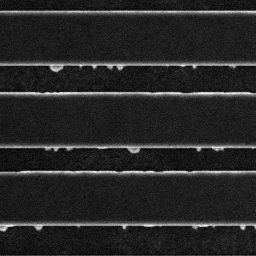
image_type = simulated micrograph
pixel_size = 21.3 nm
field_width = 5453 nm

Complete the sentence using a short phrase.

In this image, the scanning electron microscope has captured lines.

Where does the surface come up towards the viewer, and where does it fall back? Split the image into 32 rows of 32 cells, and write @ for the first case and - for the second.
--------------------------------
@@@@@@@@@@@@@@@@@@@@@@@@@@@@@@@@
@@@@@@@@@@@@@@@@@@@@@@@@@@@@@@@@
@@@@@@@@@@@@@@@@@@@@@@@@@@@@@@@@
@@@@@@@@@@@@@@@@@@@@@@@@@@@@@@@@
@@@@@@@@@@@@@@@@@@@@@@@@@@@@@@@@
@@@@@@@@@@@@@@@@@@@@@@@@@@@@@@@@
@@@@@@@@@@@@@@@@@@@@@@@@@@@@@@@@
--------------------------------
--------------------------------
--------------------------------
--------------------------------
@@@@@@@@@@@@@@@@@@@@@@@@@@@@@@@@
@@@@@@@@@@@@@@@@@@@@@@@@@@@@@@@@
@@@@@@@@@@@@@@@@@@@@@@@@@@@@@@@@
@@@@@@@@@@@@@@@@@@@@@@@@@@@@@@@@
@@@@@@@@@@@@@@@@@@@@@@@@@@@@@@@@
@@@@@@@@@@@@@@@@@@@@@@@@@@@@@@@@
------------@@-----------------@
--------------------------------
--------------------------------
--@@@@@@@@@@@@@@@@@@@@@@@@@@@@@@
@@@@@@@@@@@@@@@@@@@@@@@@@@@@@@@@
@@@@@@@@@@@@@@@@@@@@@@@@@@@@@@@@
@@@@@@@@@@@@@@@@@@@@@@@@@@@@@@@@
@@@@@@@@@@@@@@@@@@@@@@@@@@@@@@@@
@@@@@@@@@@@@@@@@@@@@@@@@@@@@@@@@
@@@@@@@@@@@@@@@@@@@@@@@@@@@@@@@@
--------------------------------
--------------------------------
--------------------------------
--------------------------------